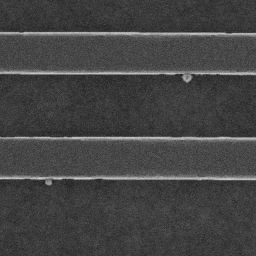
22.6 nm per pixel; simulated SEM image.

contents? lines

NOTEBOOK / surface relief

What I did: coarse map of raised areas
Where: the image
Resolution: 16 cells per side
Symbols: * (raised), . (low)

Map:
................
................
****************
****************
****************
................
................
................
................
****************
****************
................
................
................
................
................